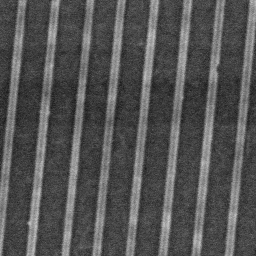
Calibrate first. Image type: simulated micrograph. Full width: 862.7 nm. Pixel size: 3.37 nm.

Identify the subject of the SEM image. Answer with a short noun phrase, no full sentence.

parallel lines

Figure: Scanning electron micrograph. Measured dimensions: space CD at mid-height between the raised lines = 85.4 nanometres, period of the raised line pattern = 111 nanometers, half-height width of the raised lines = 23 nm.